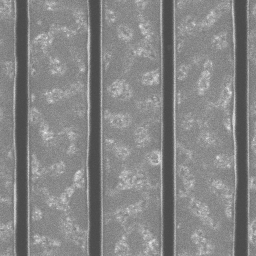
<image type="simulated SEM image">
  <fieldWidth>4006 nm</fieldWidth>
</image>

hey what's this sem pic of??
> one or a few lines or trenches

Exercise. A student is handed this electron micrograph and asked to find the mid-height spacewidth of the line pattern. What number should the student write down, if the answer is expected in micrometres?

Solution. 0.927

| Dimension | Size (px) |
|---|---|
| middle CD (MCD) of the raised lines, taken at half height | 14.1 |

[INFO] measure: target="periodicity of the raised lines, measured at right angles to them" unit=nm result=1150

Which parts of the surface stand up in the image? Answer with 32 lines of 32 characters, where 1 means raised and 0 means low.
00110000000110000000110000000110
00110000000110000000110000000110
00110000000110000000110000000110
00110000000110000000110000000110
00110000000110000000110000000110
00110000000110000000110000000110
00110000000110000000110000000110
00110000000110000000110000000110
00110000000110000000110000000110
00110000000110000000110000000110
00110000000110000000110000000110
00110000000110000000110000000110
00110000000110000000110000000110
00110000000110000000110000000110
00110000000110000000110000000110
00110000000110000000110000000110
00100000000110000000110000000110
00100000000110000000110000000110
00100000000110000000110000000110
00100000000110000000110000000110
00110000000110000000110000000110
00110000000110000000110000000110
00100000000110000000110000000010
00110000000110000000110000000110
00110000000110000000110000000110
00110000000110000000110000000110
00110000000110000000110000000110
00110000000110000000110000000110
00110000000110000000110000000110
00110000000110000000110000000110
00110000000110000000110000000110
00110000000110000000110000000110